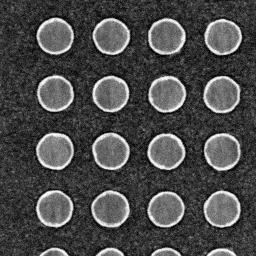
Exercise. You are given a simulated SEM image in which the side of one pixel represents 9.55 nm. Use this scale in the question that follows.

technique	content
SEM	a regular array of raised bodies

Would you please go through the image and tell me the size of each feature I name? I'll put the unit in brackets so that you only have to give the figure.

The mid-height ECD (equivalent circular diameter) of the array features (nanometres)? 334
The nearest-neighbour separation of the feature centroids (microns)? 0.529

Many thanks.